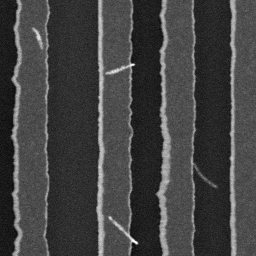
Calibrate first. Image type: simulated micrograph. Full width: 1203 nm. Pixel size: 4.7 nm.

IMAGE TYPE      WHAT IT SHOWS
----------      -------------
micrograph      lines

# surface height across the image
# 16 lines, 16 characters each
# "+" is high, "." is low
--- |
.++...++..++..++
.++...++..++...+
.++...++..++..++
.++...++..++...+
.++...++..++..++
.++...++..++..++
.++...++..++..++
.++...++..++..++
.++...++..++..++
.++...++..++..++
.++...++..++..++
.++...++..++..++
.++...++..++..++
.++...++..++..++
.++...++..++..++
.++...++..++...+